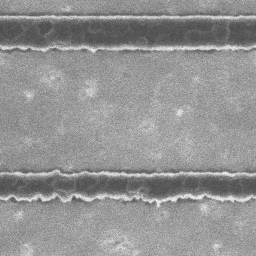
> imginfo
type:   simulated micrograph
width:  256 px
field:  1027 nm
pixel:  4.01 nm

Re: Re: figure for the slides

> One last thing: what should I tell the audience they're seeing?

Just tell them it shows one or a few lines or trenches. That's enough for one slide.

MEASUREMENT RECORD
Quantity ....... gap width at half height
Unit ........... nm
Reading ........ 500